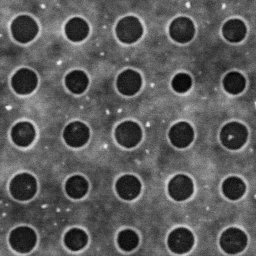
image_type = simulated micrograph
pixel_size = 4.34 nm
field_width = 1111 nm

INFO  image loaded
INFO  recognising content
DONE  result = a regular array of holes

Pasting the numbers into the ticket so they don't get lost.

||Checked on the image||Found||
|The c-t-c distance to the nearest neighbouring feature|227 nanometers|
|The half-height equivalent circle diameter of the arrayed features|27.1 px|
